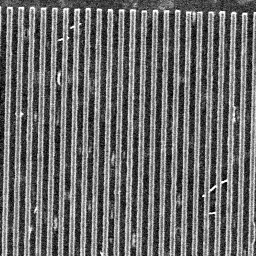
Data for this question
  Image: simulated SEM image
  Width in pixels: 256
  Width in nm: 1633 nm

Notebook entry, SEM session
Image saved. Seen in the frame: parallel lines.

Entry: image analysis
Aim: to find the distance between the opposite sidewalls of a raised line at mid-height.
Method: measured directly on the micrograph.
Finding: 0.0287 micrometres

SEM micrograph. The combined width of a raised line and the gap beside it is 71.4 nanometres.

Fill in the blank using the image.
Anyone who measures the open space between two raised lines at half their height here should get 42.2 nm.